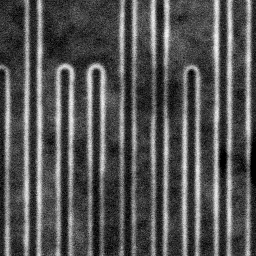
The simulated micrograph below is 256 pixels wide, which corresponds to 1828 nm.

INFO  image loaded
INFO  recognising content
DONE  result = groups of lines, slits or small figures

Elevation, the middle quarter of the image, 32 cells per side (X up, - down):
XXXXXXXXXXXXXXX--XXXXXX--XXXXXXX
--XXXXX--XXXXXX--XXXXXX--XXXXXX-
--XXXX----XXXXX--XXXXXX--XXXXX--
--XXXX----XXXXX--XXXXXX--XXXXX--
--XXXX----XXXXX--XXXXXX--XXXXX--
--XXXX----XXXXX--XXXXX---XXXXX--
--XXXX----XXXXX--XXXXX---XXXXX--
--XXXX----XXXXX--XXXXXX--XXXXX--
--XXXX----XXXXX--XXXXXX--XXXXX--
--XXXX----XXXXX--XXXXXX--XXXXX--
--XXXX----XXXXX--XXXXXX--XXXXX--
--XXXX----XXXXX--XXXXXX--XXXXX--
--XXXX----XXXXX---XXXX---XXXXX--
--XXXX----XXXXX---XXXX---XXXXX--
--XXXX----XXXXX---XXXX---XXXXX--
--XXXX----XXXXX---XXXX---XXXXX--
--XXXX----XXXXX---XXXX---XXXXX--
--XXXX----XXXXX---XXXX---XXXXX--
--XXXX----XXXXX---XXXX---XXXXX--
--XXXX----XXXXX---XXXX---XXXXX--
--XXXXX---XXXXX---XXXX---XXXXX--
--XXXXX---XXXXX---XXXX---XXXXX--
--XXXXX---XXXXX---XXXX---XXXXX--
--XXXXX--XXXXXX---XXXX---XXXXX--
--XXXXX--XXXXXX--XXXXX---XXXXX--
--XXXXX--XXXXXX--XXXXX---XXXXX--
--XXXXX--XXXXXX--XXXXX---XXXXX--
--XXXXX--XXXXXX--XXXXX---XXXXX--
--XXXXX--XXXXXX--XXXXX---XXXXX--
--XXXXX--XXXXXX--XXXXX---XXXXX--
--XXXXX--XXXXXX--XXXXX---XXXXX--
--XXXXX--XXXXXX--XXXXX---XXXXX--